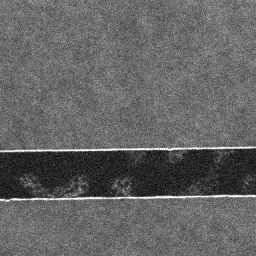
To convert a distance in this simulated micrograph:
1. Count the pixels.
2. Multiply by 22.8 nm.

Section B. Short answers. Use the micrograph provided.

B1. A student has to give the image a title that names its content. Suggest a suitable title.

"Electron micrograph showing one or a few lines or trenches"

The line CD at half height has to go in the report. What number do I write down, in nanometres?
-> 1110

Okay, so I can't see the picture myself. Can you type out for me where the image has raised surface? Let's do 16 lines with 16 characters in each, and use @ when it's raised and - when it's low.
----------------
----------------
----------------
----------------
----------------
----------------
----------------
----------------
----------------
@@@@@@@@@@@@@@@@
@@@@@@@@@@@@@@@@
@@@@@@@@@@@@@@@@
@---------------
----------------
----------------
----------------